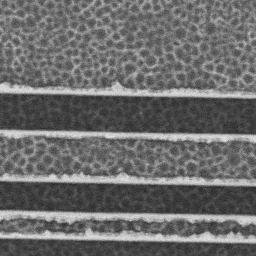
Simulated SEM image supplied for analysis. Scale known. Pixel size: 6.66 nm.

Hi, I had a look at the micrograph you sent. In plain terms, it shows one or a few lines or trenches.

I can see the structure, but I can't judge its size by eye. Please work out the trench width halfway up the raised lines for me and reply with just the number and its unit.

245 nanometres